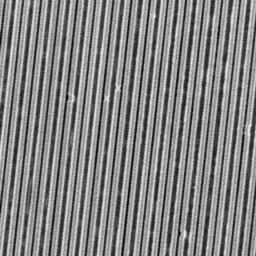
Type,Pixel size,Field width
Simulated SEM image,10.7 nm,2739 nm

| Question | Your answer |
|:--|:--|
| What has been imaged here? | parallel lines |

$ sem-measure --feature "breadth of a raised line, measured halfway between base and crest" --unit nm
54.6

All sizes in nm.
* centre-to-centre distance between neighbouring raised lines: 96.2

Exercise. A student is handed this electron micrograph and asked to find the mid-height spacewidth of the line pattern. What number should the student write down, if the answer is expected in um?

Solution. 0.0372